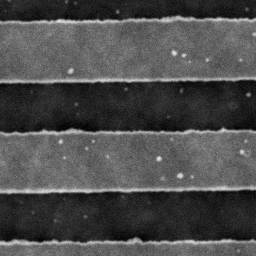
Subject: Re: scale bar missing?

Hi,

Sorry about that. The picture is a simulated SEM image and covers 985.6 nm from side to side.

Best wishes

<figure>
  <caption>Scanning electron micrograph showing lines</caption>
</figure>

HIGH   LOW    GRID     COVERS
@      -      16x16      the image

----------------
@@@@@@@@@@@@@@@@
@@@@@@@@@@@@@@@@
@@@@@@@@@@@@@@@@
@@@@@@@@@@@@@@@@
----------------
----------------
----------------
@@@@@@@@@@@@@@@@
@@@@@@@@@@@@@@@@
@@@@@@@@@@@@@@@@
@@@@@@@@@@@@@@@@
----------------
----------------
----------------
@@@@@@@@@@@@@@@@